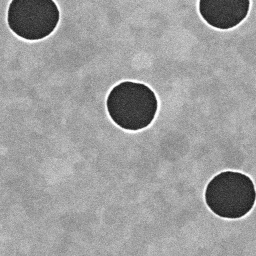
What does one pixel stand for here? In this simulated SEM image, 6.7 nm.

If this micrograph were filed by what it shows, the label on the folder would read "holes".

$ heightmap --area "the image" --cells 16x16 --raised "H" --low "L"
HLLLHHHHHHHHLLLL
HLLLHHHHHHHHHLLH
HHHHHHHHHHHHHHHH
HHHHHHHHHHHHHHHH
HHHHHHHHHHHHHHHH
HHHHHHHLLHHHHHHH
HHHHHHHLLLHHHHHH
HHHHHHHLLLHHHHHH
HHHHHHHHHHHHHHHH
HHHHHHHHHHHHHHHH
HHHHHHHHHHHHHHHH
HHHHHHHHHHHHHLLL
HHHHHHHHHHHHHLLL
HHHHHHHHHHHHHHLH
HHHHHHHHHHHHHHHH
HHHHHHHHHHHHHHHH